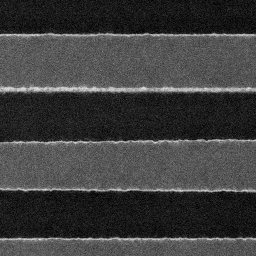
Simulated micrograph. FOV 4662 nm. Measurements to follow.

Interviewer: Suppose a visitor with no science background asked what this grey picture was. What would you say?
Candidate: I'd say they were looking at lines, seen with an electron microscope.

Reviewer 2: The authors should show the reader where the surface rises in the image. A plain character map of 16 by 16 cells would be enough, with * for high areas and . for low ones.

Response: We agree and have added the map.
................
................
****************
****************
****************
****************
................
................
................
****************
****************
****************
................
................
................
****************